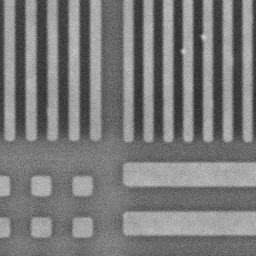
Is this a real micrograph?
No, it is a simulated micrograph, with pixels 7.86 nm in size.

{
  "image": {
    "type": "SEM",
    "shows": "groups of lines, slits or small figures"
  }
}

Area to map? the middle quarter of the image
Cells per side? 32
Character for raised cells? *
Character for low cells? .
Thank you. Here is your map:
.***...**......**...**...**...**
.***...**......**...**...**...**
.***...**......**...**...**...**
.***...**......**...**...**...**
.***...**......**...**...**...**
.***...**......**...**...**...**
.***...**......**...**...**...**
.***...**......**...**...**...**
.***...**......**...**...**...**
.***...**......**...**...**...**
.***...**......**...**...**...**
.***...**......**...**...**...**
.***...**......**...**...**...**
.***...**......**...**...**...**
.***...**......**...**...**...**
.***...**......**...**...**...**
.***...**......**...**...**...**
.***...**......**...**...**...**
.***...**......**...**...**...**
................................
................................
................................
................................
................................
................................
...............*****************
...............*****************
...............*****************
...****........*****************
..*****........*****************
..*****.........................
..*****.........................